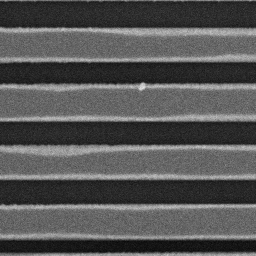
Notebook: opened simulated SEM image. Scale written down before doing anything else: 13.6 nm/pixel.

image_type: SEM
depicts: lines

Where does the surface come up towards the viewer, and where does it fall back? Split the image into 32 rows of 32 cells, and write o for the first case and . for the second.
................................
................................
................................
................................
oooooooooooooooooooooooooooooooo
oooooooooooooooooooooooooooooooo
oooooooooooooooooooooooooooooooo
ooooooooooooooooooooooooooooo.oo
................................
................................
.................oo.............
oooooooooooooooooooooooooooooooo
oooooooooooooooooooooooooooooooo
oooooooooooooooooooooooooooooooo
oooooooooooooooooooooooooooooooo
................................
................................
................................
ooooo...oooooooooooooooooooooooo
oooooooooooooooooooooooooooooooo
oooooooooooooooooooooooooooooooo
oooooooooooooooooooooooooooooooo
................................
................................
................................
................................
oooooooooooooooooooooooooooooooo
oooooooooooooooooooooooooooooooo
oooooooooooooooooooooooooooooooo
oooooooooooooooooooooooooooooooo
................................
................................